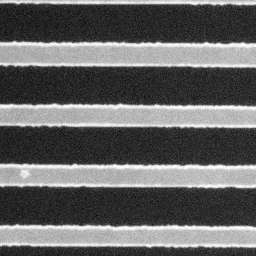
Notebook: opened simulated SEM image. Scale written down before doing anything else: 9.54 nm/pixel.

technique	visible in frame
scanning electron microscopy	lines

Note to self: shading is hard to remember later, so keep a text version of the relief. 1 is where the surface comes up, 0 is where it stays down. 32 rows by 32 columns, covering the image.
00000000000000000000000010110111
00000000000000000000000000000000
00000000000000000000000000000000
00000000000000000000000000000000
00000000000000000000000000000000
11110010101101000000000000000000
11111111111111111111111111111111
11111111111111111111111111111111
00000000000000000000000000000000
00000000000000000000000000000000
00000000000000000000000000000000
00000000000000000000000000000000
00000000000000000000000000000000
11111111111111111111111111111111
11111111111111111111111111111111
11111111111111111111111111111111
00000000000000000000000000000000
00000000000000000000000000000000
00000000000000000000000000000000
00000000000000000000000000000000
00000000000000000000000000000000
11111111111111111111111111111111
11111111111111111111111111111111
00000000000000000000000000000000
00000000000000000000000000000000
00000000000000000000000000000000
00000000000000000000000000000000
00000000000000000000000000000000
11111111111111110110111111000110
11111111111111111111111111111111
11111111111111111111111111111111
00000000000000000000000000000000